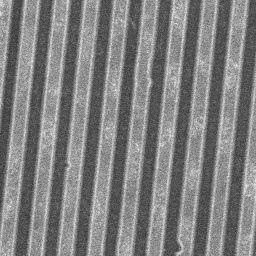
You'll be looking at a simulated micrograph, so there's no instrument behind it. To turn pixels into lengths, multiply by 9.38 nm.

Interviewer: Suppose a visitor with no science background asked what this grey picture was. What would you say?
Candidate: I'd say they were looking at parallel lines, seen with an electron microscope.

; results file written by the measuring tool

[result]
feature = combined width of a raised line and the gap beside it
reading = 277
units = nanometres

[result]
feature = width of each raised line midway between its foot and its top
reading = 147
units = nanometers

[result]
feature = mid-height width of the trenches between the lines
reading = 136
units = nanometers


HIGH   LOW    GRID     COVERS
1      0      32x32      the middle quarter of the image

00011110000111000011110000111000
00011110000111000011100000111000
00011110000111000011100001111000
00011110000111000011110001111000
00011110000111000011110001111000
00011110001111000011110001111000
00011100001111000111100001111000
00011100001111000111100001110000
00011100001111000111100001110000
00111100001111000111100001110000
00111100001110000111100001110000
00111100001110000111100001110000
00111100011110000111100011110000
00111100011110000111000011110000
00111100001110000111000011110000
00111100011110000111000011110000
00111000011110001111000011110001
00111000011110001111000011100001
01111000011110001111000011100001
01111000011110001111000011100001
01111000011100001111000011100001
01111000011100001111000011100001
01111000011100001111000111100001
01111000011100001110000111100001
01111000111100001110000111100001
01111000111100011110000111100011
01110000111100011110000111100011
01110000111100011110000111000011
11110000111100011110000111000011
11110000111000011110000111000011
11110000111000011110000111000011
11110000111000011110001111000011